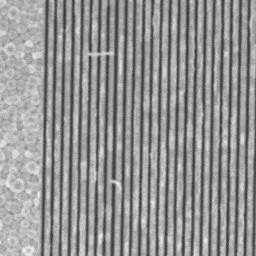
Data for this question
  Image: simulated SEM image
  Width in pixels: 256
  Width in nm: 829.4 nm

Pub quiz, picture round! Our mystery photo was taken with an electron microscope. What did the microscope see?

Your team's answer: parallel lines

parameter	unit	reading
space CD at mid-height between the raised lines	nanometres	9.7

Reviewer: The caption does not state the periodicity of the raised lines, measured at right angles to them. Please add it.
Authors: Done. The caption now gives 8.8 pixels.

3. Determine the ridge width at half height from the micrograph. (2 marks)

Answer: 19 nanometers